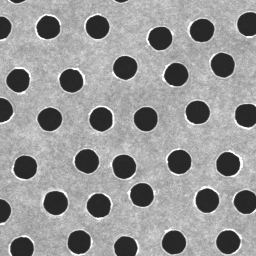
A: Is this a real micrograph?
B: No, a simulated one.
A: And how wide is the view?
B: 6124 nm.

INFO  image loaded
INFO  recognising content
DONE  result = a regular array of holes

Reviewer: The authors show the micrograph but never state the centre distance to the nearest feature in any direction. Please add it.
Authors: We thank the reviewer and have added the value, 1050 nanometers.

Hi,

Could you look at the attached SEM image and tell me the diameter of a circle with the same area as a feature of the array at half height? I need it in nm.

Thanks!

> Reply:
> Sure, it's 579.